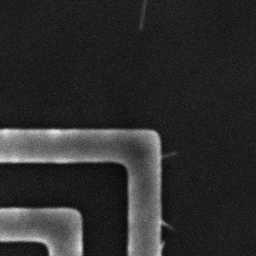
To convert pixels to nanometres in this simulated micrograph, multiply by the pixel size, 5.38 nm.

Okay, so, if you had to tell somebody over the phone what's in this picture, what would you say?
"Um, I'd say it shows groups of lines, slits or small figures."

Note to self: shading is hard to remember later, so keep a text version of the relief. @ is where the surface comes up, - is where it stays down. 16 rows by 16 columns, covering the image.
----------------
----------------
----------------
----------------
----------------
----------------
----------------
----------------
@@@@@@@@@@------
@@@@@@@@@@------
--------@@------
--------@@------
--------@@------
@@@@@---@@------
@@@@@---@@------
---@@---@@------